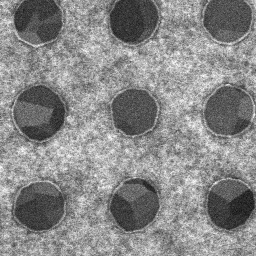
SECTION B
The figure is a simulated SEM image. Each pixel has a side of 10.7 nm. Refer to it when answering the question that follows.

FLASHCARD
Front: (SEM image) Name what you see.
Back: raised bodies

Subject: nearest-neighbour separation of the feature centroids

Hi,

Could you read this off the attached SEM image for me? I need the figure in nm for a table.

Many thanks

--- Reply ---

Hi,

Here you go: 997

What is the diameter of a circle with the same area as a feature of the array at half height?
548 nm